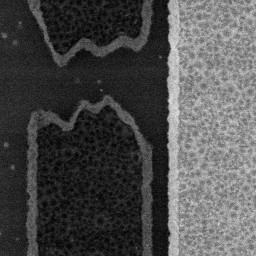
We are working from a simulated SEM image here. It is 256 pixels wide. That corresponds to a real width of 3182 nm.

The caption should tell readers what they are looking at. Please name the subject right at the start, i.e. one or a few lines or trenches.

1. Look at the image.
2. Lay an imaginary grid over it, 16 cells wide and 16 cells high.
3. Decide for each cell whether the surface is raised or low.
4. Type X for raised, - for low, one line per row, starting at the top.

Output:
--XXXXXXX--XXXXX
---XXXXXX--XXXXX
---XXXXXX--XXXXX
-----------XXXXX
-----------XXXXX
-----------XXXXX
------X----XXXXX
--X--XXX---XXXXX
--XXXXXXX--XXXXX
--XXXXXXX--XXXXX
--XXXXXXX--XXXXX
--XXXXXXX--XXXXX
--XXXXXXX--XXXXX
--XXXXXXX--XXXXX
--XXXXXXX--XXXXX
--XXXXXXX--XXXXX